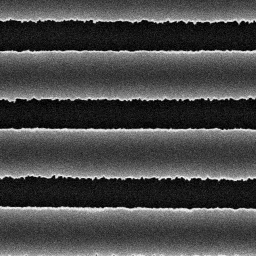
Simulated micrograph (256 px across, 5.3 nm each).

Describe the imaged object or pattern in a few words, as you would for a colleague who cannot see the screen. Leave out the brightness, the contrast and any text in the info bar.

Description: lines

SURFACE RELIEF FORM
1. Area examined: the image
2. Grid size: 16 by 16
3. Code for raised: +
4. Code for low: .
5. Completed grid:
++++++++++++++++
................
................
++++++++++++++++
++++++++++++++++
++++++++++++++++
................
................
++++++++++++++++
++++++++++++++++
++++++++++++++++
................
................
++++++++++++++++
++++++++++++++++
++++++++++++++++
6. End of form